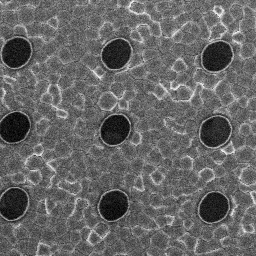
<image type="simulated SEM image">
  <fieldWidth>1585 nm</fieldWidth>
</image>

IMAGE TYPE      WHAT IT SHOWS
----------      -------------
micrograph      raised bodies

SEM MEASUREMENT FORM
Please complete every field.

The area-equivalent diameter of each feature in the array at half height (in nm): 195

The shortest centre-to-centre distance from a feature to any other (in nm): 467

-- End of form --